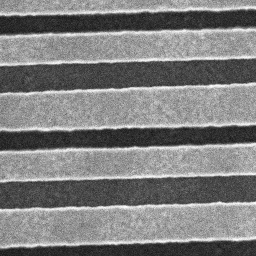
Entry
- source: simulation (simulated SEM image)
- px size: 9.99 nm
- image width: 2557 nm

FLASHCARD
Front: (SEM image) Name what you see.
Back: lines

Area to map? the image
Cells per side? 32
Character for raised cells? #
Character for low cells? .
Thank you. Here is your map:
################################
#################...............
................................
................................
#.##############################
################################
################################
###################.............
................................
................................
...............................#
.....###########################
################################
################################
################################
################################
................................
................................
................################
################################
################################
################################
#####...........................
................................
................................
..........................######
################################
################################
################################
################################
##########......................
................................